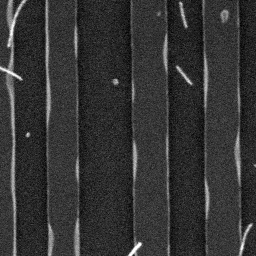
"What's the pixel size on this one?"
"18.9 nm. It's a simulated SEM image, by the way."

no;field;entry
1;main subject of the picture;groups of lines, slits or small figures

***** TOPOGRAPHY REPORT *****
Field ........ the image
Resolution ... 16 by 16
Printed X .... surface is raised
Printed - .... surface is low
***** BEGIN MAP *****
X--XX---XX---XX-
X--XX---XX---XX-
X--XX---XX---XX-
X--XX---XX---XX-
X--XX---XX---XX-
X--XX---XX---XX-
X--XX---XX---XX-
X--XX---XX---XX-
X--XX---XX---XX-
X--XX---XX---XX-
X--XX---XX---XX-
X--XX---XX---XX-
X--XX---XXX--XX-
X--XX---XXX--XX-
X--XX---XXX--XX-
X--XX---XXX--XX-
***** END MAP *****